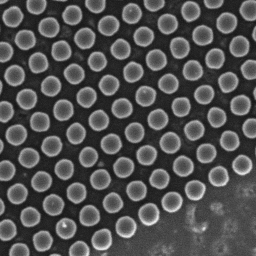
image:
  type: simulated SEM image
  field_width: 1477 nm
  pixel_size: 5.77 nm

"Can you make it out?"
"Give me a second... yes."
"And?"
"a regular array of raised bodies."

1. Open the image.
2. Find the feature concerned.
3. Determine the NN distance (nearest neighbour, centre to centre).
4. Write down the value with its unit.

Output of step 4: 151 nanometers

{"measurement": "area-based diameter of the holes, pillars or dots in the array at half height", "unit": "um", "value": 0.115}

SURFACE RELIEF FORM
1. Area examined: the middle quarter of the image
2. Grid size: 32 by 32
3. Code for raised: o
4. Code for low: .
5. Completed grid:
.ooo...ooo......ooo..oooo.....oo
ooooo..oo......ooooo..o.......oo
ooooo..........ooooo..........oo
ooooo.....ooo..oooo.....oooo..oo
.ooo.....ooooo..........oooo....
.........ooooo..........ooooo...
....ooo..oooo......ooo..oooo....
...ooooo..oo......ooooo.........
...ooooo..........ooooo.........
o...oooo.....ooo..oooo.....oooo.
oo...oo.....ooooo...o......ooooo
oo..........ooooo......o...oooo.
oo.....ooo..ooooo....ooooo..ooo.
o.....ooooo..........ooooo......
......ooooo..........ooooo......
..ooo..oooo.....ooo...ooo.....oo
.oooo...o......ooooo..........oo
.oooo..........ooooo.....ooo..oo
.oooo.....oooo..oooo....ooooo..o
..oo.....ooooo...oo.....ooooo...
.........ooooo......o...ooooo...
.....ooo..oooo.....oooo..ooo....
....oooo..........ooooo.........
....oooo......o...ooooo.....ooo.
oo..oooo.....oooo..ooo......oooo
oo...oo.....ooooo..........ooooo
oo.......o..ooooo......o....oooo
oo.....oooo..oooo.....oooo..ooo.
o......oooo...........oooo......
.......oooo......oo..ooooo.....o
.oooo..oooo.....oooo..oooo....oo
.oooo...........ooooo.........oo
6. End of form